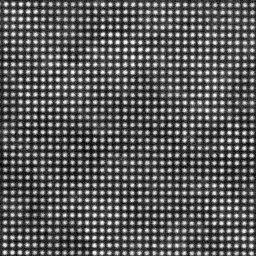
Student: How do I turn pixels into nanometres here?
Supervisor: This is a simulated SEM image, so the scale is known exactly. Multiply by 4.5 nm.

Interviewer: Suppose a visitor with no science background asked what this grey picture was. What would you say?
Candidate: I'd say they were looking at a regular array of raised bodies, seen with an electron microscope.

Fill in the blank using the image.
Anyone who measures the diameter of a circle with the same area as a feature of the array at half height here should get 16.1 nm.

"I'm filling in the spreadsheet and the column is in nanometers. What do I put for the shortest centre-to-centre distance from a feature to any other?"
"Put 32.1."